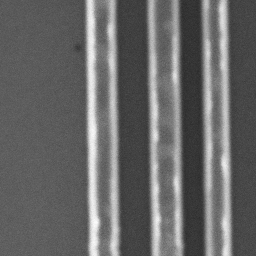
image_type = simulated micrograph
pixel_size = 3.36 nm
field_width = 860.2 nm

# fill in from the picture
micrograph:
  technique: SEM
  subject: parallel lines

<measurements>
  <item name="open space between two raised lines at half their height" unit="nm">108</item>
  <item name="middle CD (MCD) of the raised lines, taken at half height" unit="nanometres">83.9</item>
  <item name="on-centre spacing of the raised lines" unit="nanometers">190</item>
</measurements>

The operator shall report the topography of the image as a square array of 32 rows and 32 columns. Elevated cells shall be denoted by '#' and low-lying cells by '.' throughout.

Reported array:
...........###.....###....##....
...........###.....###....##....
...........###.....###....##....
...........###.....###....##....
...........###.....###....##....
...........###.....###....##....
...........###.....###....##....
...........###.....###....##....
...........###.....###....##....
...........###.....###....##....
...........###.....###....##....
...........###.....###....##....
...........###.....###....##....
...........###.....###....##....
...........###.....###....##....
...........###.....###....##....
...........###.....###....##....
...........###.....###....##....
...........###.....###....##....
...........###.....###....##....
...........###.....###....##....
...........###.....###....##....
...........###.....###....##....
...........###.....###....##....
...........####....###....##....
............###....###....##....
............###....###....##....
............###....###....##....
............###....###....###...
............###....###....###...
...........####....####...###...
...........####....####...###...